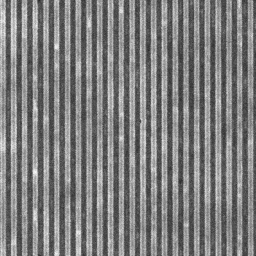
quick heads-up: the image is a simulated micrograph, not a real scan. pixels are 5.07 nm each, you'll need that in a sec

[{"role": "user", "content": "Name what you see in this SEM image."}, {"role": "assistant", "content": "parallel lines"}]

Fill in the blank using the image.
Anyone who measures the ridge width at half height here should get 0.0235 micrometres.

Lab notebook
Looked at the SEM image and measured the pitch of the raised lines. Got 54.6 nm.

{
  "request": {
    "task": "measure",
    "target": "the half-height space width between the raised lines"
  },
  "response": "6.13 pixels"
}